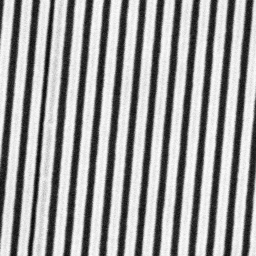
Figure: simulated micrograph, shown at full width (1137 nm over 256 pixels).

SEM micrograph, parallel lines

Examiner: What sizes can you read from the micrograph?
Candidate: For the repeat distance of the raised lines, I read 78.7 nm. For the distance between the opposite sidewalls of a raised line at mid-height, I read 42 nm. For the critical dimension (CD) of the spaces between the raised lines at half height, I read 0.0381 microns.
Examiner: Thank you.